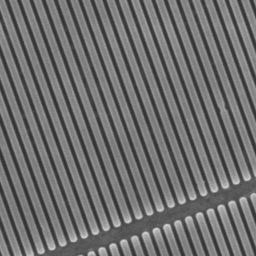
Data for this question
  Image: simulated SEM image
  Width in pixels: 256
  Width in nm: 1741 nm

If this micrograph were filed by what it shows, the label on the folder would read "parallel lines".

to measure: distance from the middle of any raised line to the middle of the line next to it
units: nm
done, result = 78.3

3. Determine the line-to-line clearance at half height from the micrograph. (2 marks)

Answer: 0.0304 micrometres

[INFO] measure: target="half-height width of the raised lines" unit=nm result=48.8